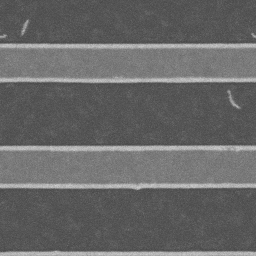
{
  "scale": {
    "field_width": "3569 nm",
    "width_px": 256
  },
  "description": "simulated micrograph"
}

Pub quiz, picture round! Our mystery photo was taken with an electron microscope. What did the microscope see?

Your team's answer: one or a few lines or trenches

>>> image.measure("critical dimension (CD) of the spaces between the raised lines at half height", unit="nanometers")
955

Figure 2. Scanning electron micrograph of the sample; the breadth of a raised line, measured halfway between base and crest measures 505 nm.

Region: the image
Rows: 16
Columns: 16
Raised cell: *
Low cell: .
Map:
................
................
................
****************
****************
................
................
................
................
****************
****************
****************
................
................
................
................